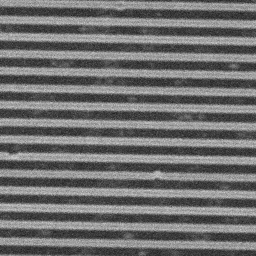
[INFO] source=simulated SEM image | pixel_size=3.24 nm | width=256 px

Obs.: parallel lines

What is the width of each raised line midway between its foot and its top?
19.8 nm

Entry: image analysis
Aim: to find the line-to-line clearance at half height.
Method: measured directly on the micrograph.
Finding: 34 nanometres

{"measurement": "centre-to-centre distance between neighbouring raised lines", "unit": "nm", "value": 55.2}